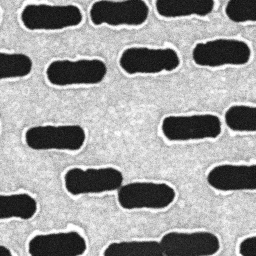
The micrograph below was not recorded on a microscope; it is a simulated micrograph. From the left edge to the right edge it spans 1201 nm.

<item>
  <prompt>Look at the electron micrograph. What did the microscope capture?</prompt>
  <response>holes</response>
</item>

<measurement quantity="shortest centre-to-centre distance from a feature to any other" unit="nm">332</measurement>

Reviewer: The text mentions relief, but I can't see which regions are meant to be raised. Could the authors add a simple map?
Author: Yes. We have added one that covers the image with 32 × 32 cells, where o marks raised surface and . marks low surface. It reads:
oooooooooooo......oo.......o....
ooo.......o........o......oo....
ooo.......o.......ooooooooooo...
ooo.....oooooooooooooooooooooooo
oooooooooooooooooooooooooooooooo
ooooooooooooooooooooooooo......o
oooooooooooooooo......oo.......o
....oooooo..ooo.......oo.......o
....oo.......oo.......oooooooooo
...ooo.......ooooooooooooooooooo
ooooooo...oooooooooooooooooooooo
oooooooooooooooooooooooooooooooo
oooooooooooooooooooooooooooooooo
ooooooooooooooooooooooooooooo...
oooooooooooooooooooooo.....o....
oooooooooooooooooooo.......o....
ooo........ooooooooo.......ooooo
ooo........ooooooooooo.ooooooooo
oooo......oooooooooooooooooooooo
oooooooooooooooooooooooooooooooo
oooooooooooooooooooooooooooooooo
ooooooooo......ooooooooooo......
oooooooo.......ooooooooooo......
oooooooo.............oooooo.....
....ooooooooooo.......oooooooooo
.....oooooooooo......ooooooooooo
....oooooooooooooooooooooooooooo
oooooooooooooooooooooooooooooooo
oooooooooooooooooooooooooooooooo
ooooo.....ooooooooooo......ooooo
oooo.......ooo.............ooo..
.ooo......ooo..............ooo..